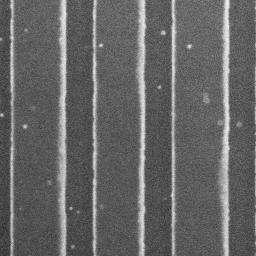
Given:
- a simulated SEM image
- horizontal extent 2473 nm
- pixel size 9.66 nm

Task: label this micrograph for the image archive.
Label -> lines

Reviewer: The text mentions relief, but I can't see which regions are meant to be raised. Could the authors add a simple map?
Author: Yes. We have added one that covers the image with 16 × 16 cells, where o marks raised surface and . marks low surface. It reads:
.ooo..ooo..ooo..
.ooo..ooo..ooo..
.ooo..ooo..ooo..
.ooo..ooo..ooo..
.ooo..ooo..ooo..
.ooo..ooo..ooo..
.ooo..ooo..ooo..
.ooo..ooo..ooo..
.ooo..ooo..ooo..
.ooo..ooo..ooo..
.ooo..ooo..ooo..
.ooo..ooo..ooo..
.ooo..ooo..ooo..
.ooo..ooo..ooo..
.ooo..ooo..ooo..
.ooo..ooo..ooo..